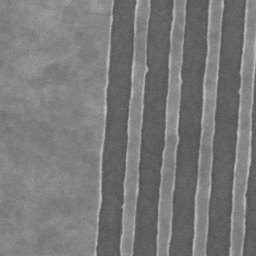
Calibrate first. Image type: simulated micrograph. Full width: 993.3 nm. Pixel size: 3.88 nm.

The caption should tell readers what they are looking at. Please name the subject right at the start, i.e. parallel lines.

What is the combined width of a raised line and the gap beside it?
141 nanometers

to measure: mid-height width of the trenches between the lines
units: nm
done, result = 91.8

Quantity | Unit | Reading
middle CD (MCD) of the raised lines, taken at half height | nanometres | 49.3